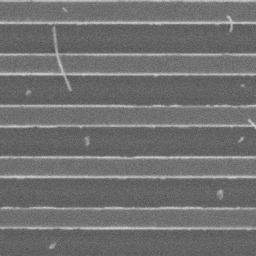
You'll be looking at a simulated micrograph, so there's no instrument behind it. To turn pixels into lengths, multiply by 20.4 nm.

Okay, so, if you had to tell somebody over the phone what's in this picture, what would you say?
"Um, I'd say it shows lines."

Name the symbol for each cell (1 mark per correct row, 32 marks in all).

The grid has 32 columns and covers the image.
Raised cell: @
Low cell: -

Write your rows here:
@@@@@@@@@@@@@@@@@@@@@@@@@@@@@@@@
@@@@@@@@@@@@@@@@@@@@@@@@@@@@@@@@
@@@@@@@@@@@@@@@@@@@@@@@@@@@@@@@@
--------------------------------
--------------------------------
--------------------------------
--------------------------------
@@@@@@@@@@@@@@@@@@@@@@@@@@@@@@@@
@@@@@@@@@@@@@@@@@@@@@@@@@@@@@@@@
--------------------------------
--------------------------------
--------------------------------
--------------------------------
@@@@@@@@@@@@@@@@@@@@@@@@@@@@@@@@
@@@@@@@@@@@@@@@@@@@@@@@@@@@@@@@@
@@@@@@@@@@@@@@@@@@@@@@@@@@@@@@@@
--------------------------------
--------------------------------
--------------------------------
--------------------------------
@@@@@@@@@@@@@@@@@@@@@@@@@@@@@@@@
@@@@@@@@@@@@@@@@@@@@@@@@@@@@@@@@
--------------------------------
--------------------------------
--------------------------------
--------------------------------
@@@@@@@@@@@@@@@@@@@@@@@@@@@@@@@@
@@@@@@@@@@@@@@@@@@@@@@@@@@@@@@@@
-----@--@-@@@@@@@@@@@@@@@@@@@@@@
--------------------------------
--------------------------------
--------------------------------